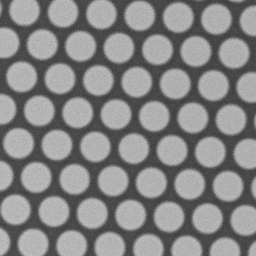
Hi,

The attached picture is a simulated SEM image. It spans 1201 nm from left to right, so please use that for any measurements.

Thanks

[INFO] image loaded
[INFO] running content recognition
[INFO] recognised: an array of small figures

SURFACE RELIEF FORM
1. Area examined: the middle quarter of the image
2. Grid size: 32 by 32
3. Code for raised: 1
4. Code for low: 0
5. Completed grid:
10000000100000000000000000000000
11000011111000001111000000111000
11100111111100011111100001111110
11100111111100011111110011111110
11100111111100011111110011111111
11000111111100011111110011111111
10000011111000011111100011111110
00000001110000001111000001111110
00010000000000000000000000011000
01111100000111100000011000000000
11111110001111110000111110000011
11111110011111111001111111000111
11111110011111111001111111000111
11111110011111111001111111001111
11111100001111110001111111000111
00111000000111100000111110000111
00000000000000000000011100000011
10000011110000000100000000000000
11000111111000011111000001111000
11001111111000111111100011111100
11001111111000111111100111111110
11001111111000111111100111111110
10000111111000111111100111111110
00000111110000011111000011111100
00000000000000001110000001111000
01110000000000000000000000000000
11111100001111100000111100000011
11111100011111110001111110000111
11111100011111110011111110001111
11111100011111110011111111001111
11111100011111110011111111001111
11111000011111100001111110001111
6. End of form